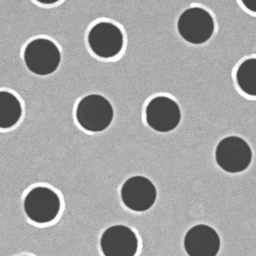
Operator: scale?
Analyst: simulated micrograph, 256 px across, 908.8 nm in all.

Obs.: a regular array of holes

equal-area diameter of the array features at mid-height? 0.128 microns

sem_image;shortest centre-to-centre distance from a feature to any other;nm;266